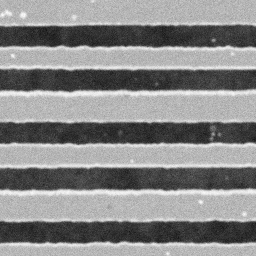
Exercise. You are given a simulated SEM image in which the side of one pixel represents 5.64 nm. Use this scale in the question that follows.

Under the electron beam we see lines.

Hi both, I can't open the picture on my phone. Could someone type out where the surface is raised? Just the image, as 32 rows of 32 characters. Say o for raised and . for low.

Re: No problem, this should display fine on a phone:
oooooooooooooooooooooooooooooooo
oooooooooooooooooooooooooooooooo
oooooooooooooooooooooooooooooooo
................................
................................
................................
oooooooooooooooooooooooooooooooo
oooooooooooooooooooooooooooooooo
oooooooooooooooooooooooooooooooo
................................
................................
oooooooooooooooooooooooooooooooo
oooooooooooooooooooooooooooooooo
oooooooooooooooooooooooooooooooo
oooooooooooooooooooooooooooooooo
................................
................................
................................
oooooooooooooooooooooooooooooooo
oooooooooooooooooooooooooooooooo
oooooooooooooooooooooooooooooooo
................................
................................
................................
oooooooooooooooooooooooooooooooo
oooooooooooooooooooooooooooooooo
oooooooooooooooooooooooooooooooo
oooooooooooooooooooooooooooooooo
................................
................................
oooo.oooo..ooo.ooooo.ooooooo...o
oooooooooooooooooooooooooooooooo